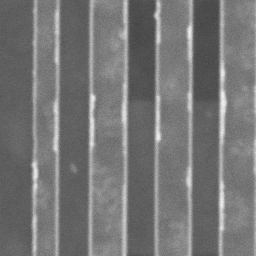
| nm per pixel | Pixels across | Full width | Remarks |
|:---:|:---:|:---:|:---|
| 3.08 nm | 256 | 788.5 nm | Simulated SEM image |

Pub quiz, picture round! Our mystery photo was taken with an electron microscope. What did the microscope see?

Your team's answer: one or a few lines or trenches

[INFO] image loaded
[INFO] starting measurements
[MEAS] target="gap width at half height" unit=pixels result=30.5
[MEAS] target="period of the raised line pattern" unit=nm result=197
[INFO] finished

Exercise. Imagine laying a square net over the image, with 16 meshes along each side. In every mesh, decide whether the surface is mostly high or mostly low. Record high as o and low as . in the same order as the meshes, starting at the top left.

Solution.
..oo..oo..oo..oo
..oo..oo..oo..oo
..oo..oo..oo..oo
..oo..oo..oo..oo
..oo..oo..oo..oo
..oo..oo..oo..oo
..oo..oo..oo..oo
..oo..oo..oo..oo
..oo..oo..oo..oo
..oo..oo..oo..oo
..oo..oo..oo..oo
..oo..oo..oo..oo
..oo..oo..oo..oo
..oo..oo..oo..oo
..oo..oo..oo..oo
..oo..oo..oo..oo